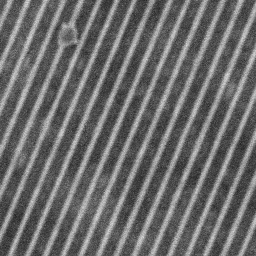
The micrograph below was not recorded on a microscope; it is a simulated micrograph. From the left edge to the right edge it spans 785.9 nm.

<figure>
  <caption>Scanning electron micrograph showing parallel lines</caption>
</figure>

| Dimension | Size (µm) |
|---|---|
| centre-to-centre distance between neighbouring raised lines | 0.0503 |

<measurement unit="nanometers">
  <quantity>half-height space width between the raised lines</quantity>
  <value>39.4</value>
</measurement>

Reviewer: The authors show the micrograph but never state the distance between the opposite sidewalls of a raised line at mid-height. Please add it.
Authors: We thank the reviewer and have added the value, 12 nanometers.